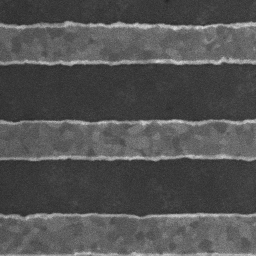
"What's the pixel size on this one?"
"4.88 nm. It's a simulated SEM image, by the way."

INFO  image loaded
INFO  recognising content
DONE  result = one or a few lines or trenches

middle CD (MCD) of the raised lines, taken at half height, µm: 0.184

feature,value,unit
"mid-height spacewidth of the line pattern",278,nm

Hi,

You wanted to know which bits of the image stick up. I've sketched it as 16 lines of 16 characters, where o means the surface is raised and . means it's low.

................
....o..........o
oooooooooooooooo
oooooooooooooooo
................
................
................
................
oooooooooooooooo
oooooooooooooooo
................
................
................
o.oooooo..oooooo
oooooooooooooooo
oooooooooooooooo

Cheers